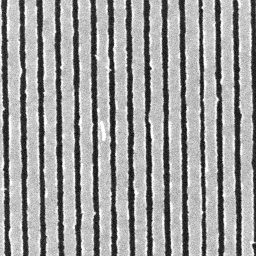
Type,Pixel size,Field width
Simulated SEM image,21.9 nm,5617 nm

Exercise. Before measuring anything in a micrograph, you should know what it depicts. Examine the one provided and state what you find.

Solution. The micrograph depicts parallel lines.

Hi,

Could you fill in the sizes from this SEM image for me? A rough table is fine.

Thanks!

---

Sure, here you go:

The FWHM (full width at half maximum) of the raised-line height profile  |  0.252 µm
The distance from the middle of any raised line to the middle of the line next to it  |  391 nm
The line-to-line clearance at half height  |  137 nanometres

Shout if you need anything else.